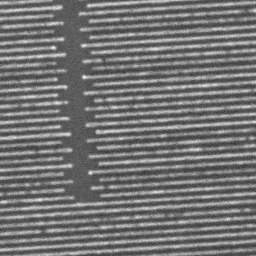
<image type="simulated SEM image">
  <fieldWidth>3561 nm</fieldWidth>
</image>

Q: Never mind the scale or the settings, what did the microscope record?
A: parallel lines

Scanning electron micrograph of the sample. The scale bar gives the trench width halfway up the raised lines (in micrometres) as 0.0885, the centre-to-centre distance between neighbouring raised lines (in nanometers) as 110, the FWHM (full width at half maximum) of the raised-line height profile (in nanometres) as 20.8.